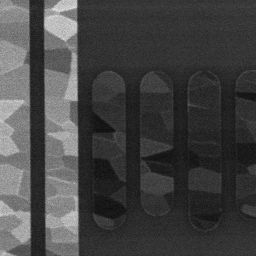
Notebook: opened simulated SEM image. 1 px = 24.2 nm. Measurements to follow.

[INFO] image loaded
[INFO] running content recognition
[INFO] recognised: groups of lines, slits or small figures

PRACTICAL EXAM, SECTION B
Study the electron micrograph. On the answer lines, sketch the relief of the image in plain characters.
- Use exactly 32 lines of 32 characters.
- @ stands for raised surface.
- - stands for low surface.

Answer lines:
@@@@--@@@@----------------------
@@@@--@@@@----------------------
@@@@--@@@@----------------------
@@@@--@@@@----------------------
@@@@--@@@@----------------------
@@@@--@@@@----------------------
@@@@--@@@@----------------------
@@@@--@@@@----------------------
@@@@--@@@@----------------------
@@@@--@@@@--@@@---@@@---@@@---@@
@@@@--@@@@--@@@@--@@@---@@@@--@@
@@@@--@@@@--@@@@--@@@@--@@@@-@@@
@@@@--@@@@--@@@@--@@@@--@@@@-@@@
@@@@--@@@@--@@@@--@@@@--@@@@-@@@
@@@@--@@@@--@@@@--@@@@--@@@@--@@
@@@@--@@@@--@@@@--@@@@--@@@@--@@
@@@@--@@@@--@@@@--@@@@--@@@@--@@
@@@@--@@@@--@@@@--@@@@--@@@@--@@
@@@@--@@@@--@@@@--@@@@--@@@@--@@
@@@@--@@@@--@@@@--@@@@--@@@@--@@
@@@@--@@@@--@@@@--@@@@--@@@@--@@
@@@@--@@@@--@@@@--@@@@--@@@@--@@
@@@@--@@@@--@@@@--@@@@--@@@@--@@
@@@@--@@@@--@@@@--@@@@--@@@@--@@
@@@@--@@@@--@@@@--@@@@--@@@@--@@
@@@@--@@@@--@@@@--@@@@--@@@@--@@
@@@@--@@@@--@@@@--@@@---@@@@--@@
@@@@--@@@@--@@@@--------@@@@----
@@@@--@@@@---@@---------@@@-----
@@@@--@@@@----------------------
@@@@--@@@@----------------------
@@@@--@@@@----------------------